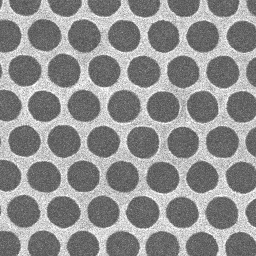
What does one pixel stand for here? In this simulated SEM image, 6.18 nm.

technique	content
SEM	a regular array of holes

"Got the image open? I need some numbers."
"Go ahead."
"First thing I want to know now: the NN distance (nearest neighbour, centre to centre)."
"244 nm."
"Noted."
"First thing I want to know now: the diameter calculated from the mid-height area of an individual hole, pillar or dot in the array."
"0.201 microns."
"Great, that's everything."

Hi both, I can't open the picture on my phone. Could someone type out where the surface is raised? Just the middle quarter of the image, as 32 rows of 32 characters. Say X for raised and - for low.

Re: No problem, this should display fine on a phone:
----XX--------XX--------XX------
----XX--------XX--------XX------
----XX--------XX--------XX------
----XX--------XX--------XX------
---XXXX------XXXX------XXXX-----
--XXXXXX----XXXXXX----XXXXXX----
XXXX-XXXXXXXXXXXXXXXXXXXXXXXXXXX
XX------XXXX------XXXX-----XXXXX
X--------XXX-------XX-------XXX-
X--------XX--------XX--------XX-
X--------XX--------X---------XX-
X--------XX--------XX--------XX-
XX-------XX--------XX--------XX-
XX------XXXX------XXXX------XXXX
XXXX--XXXXXXX---XXXXXXXX--XXXXXX
-XXXXXXXX-XXXXXXXXXXXXXXXXXXXXXX
---XXXX-----XXXXX------XXXX-----
----XX-------XXX-------XXX------
----XX--------XX--------XX------
----XX--------XX--------XX------
----XX--------XX--------XX------
----XX-------XXX-------XXX------
---XXXX------XXXX------XXXX-----
-XXXXXXXXXXXXXXXXXX--XXXXXXXXXXX
XXX----XXXXXX---XXXXXXXX-XXXXXXX
XX------XXXX------XXXX-----XXXXX
X--------XX-------XXX-------XXX-
X--------XX--------XX--------XX-
X--------XX--------XX--------X--
X--------XX--------XX--------XX-
XX------XXX-------XXX-------XXX-
XXX----XXXXX-----XXXXX-----XXXXX